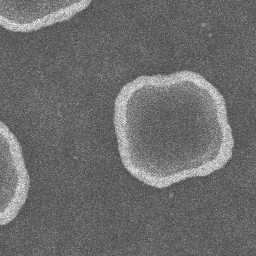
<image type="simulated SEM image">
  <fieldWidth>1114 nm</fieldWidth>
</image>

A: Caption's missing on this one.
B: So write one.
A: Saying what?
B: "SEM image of raised bodies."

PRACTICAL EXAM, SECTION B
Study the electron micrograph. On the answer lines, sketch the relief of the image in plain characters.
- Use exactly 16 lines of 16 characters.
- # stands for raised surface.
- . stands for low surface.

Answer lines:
#####...........
##..............
................
................
................
........#####...
........######..
.......#######..
#.......######..
#.......######..
#.......#####...
#...............
#...............
................
................
................